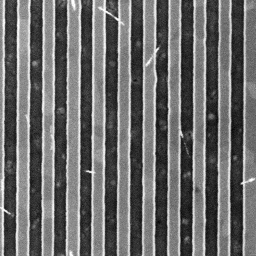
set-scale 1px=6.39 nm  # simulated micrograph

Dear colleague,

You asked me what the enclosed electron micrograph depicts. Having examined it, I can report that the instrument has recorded parallel lines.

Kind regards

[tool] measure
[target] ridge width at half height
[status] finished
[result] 0.0711 microns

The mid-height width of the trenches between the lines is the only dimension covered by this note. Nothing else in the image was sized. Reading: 86.2 nanometres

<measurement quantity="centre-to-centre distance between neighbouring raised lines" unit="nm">161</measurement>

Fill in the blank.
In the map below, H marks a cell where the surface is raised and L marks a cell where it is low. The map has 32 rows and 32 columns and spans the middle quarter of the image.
LHHHLLLHHHLLLLHHLLLLHHHLLLHHHLLL
LHHHLLLHHHLLLLHHLLLLHHHLLLHHHLLL
LHHHLLLHHHLLLLHHHLLLHHHLLLHHHLLL
LHHHLLLHHHLLLLHHHLLLHHHLLLHHHLLL
LHHHLLLHHHLLLLHHHLLLHHHLLLHHHLLL
LHHHLLLHHHLLLLHHLLLLHHHLLLHHHLLL
LHHHLLLHHHLLLLHHHLLLHHHLLLHHHLLL
LHHHLLLHHHLLLLHHLLLLHHHLLLHHHLLL
LHHHLLLHHHLLLLHHLLLLHHHLLLHHHLLL
LHHHLLLHHHLLLLHHHLLLHHHLLLHHHLLL
LHHHLLLHHHLLLLHHLLLLHHHLLLHHHLLL
LHHHLLLHHHLLLLHHLLLLHHHLLLHHHLLL
LHHHLLLHHHLLLLHHLLLLHHHLLLHHHLLL
LHHHLLLHHHLLLLHHLLLLHHHLLLHHHLLL
LHHHLLLHHHLLLLHHLLLLHHHLLLHHHLLL
LHHHLLLHHHLLLLHHLLLLHHHLLLHHHLLL
LHHHLLLHHHLLLLHHLLLLHHHLLLHHHLLL
LHHHLLLHHHLLLLHHLLLLHHHLLLHHHLLL
LHHHLLLHHHLLLLHHLLLLHHHLLLHHHLLL
LHHHLLLHHHLLLLHHLLLLHHHLLLHHHLLL
LHHHLLLHHHLLLLHHLLLLHHHLLLHHHLLL
LHHHLLLHHHLLLLHHLLLLHHHLLLHHHLLL
LHHHLLLHHHLLLLHHLLLLHHHLLLHHHLLL
LHHHLLLHHHLLLLHHLLLLHHHLLLHHHLLL
LHHHLLLHHHLLLLHHLLLLHHHLLLHHHLLL
LHHHLLLHHHLLLLHHLLLLHHHLLLHHHLLL
LHHHLLLHHHLLLLHHLLLLHHHLLLHHHLLL
LHHHLLLHHHLLLLHHLLLLHHHLLLHHHLLL
LHHHLLLHHHLLLLHHLLLLHHHLLLHHHLLL
LHHHLLLHHHLLLLHHLLLLHHHLLLHHHLLL
LHHHLLLHHHLLLHHHLLLLHHHLLLHHHLLL
LHHHLLLHHHLLLHHHLLLLHHHLLLHHHLLL